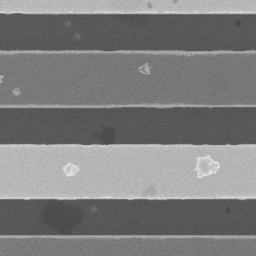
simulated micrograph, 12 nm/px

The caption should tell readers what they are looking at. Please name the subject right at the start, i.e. lines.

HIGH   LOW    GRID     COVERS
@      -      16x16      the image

@@@@@@@@@@@@@@@@
----------------
----------------
@@@@@@@@@@@@@@@@
@@@@@@@@@@@@@@@@
@@@@@@@@@@@@@@@@
@@@@@@@@@@@@@@@@
----------------
----------------
@@@@@@@@@@@@@@@@
@@@@@@@@@@@@@@@@
@@@@@@@@@@@@@@@@
----------------
----------------
----------------
@@@@@@@@@@@@@@@@